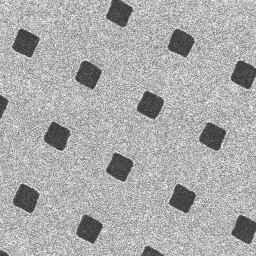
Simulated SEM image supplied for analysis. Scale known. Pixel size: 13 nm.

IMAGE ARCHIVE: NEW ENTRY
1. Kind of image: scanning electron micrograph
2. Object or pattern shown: a regular array of holes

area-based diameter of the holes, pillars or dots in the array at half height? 0.335 micrometres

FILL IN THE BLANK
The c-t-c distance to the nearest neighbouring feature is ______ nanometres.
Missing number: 902